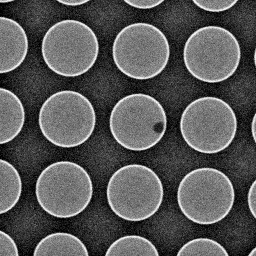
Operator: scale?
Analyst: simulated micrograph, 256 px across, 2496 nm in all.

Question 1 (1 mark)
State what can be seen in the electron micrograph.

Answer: an array of small figures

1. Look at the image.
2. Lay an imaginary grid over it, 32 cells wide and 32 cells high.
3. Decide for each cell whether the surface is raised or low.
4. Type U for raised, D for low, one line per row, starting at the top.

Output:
DDDDDDDDUUDDDDDDUUUUDDDDDUUUUDDD
DDDDDDDDDDDDDDDDDDDDDDDDDDDDDDDD
UDDDDDDDDDDDDDDDDDDDDDDDDDDDDDDD
UUUDDDUUUUUDDDDDUUUDDDDDDUUDDDDD
UUUDDDUUUUUUDDDUUUUUDDDDUUUUUDDD
UUUDDUUUUUUUDDUUUUUUUDDUUUUUUUDD
UUUDDUUUUUUUDDUUUUUUUDDUUUUUUUDD
UUUDDDUUUUUUDDUUUUUUUDDUUUUUUUDD
UUDDDDUUUUUDDDDUUUUUDDDUUUUUUUDD
DDDDDDDDDDDDDDDDUUUDDDDDUUUUUDDD
DDDDDDDDDDDDDDDDDDDDDDDDDDDDDDDD
UDDDDDDDUDDDDDDDDDDDDDDDDDDDDDDD
UUDDDDUUUUUDDDDUUUUDDDDDDUUUDDDD
UUUDDUUUUUUUDDUUUUUUDDDUUUUUUDDD
UUUDDUUUUUUUDDUUUUUUUDDUUUUUUDDD
UUUDDUUUUUUUDDUUUUUUUDDUUUUUUDDD
UUDDDUUUUUUDDDUUUUUUDDDUUUUUUDDD
UDDDDDUUUUUDDDDUUUUUDDDUUUUUUDDD
DDDDDDDDDDDDDDDDUUUDDDDDUUUUDDDD
DDDDDDDDDDDDDDDDDDDDDDDDDDDDDDDD
UDDDDDDUUDDDDDDDDDDDDDDDDDDDDDDD
UUDDDUUUUUUDDDDUUUUDDDDDUUUDDDDD
UUDDDUUUUUUDDDUUUUUUDDDUUUUUUDDD
UUUDDUUUUUUDDUUUUUUUDDUUUUUUUDDU
UUDDDUUUUUUDDUUUUUUUDDUUUUUUUDDU
UUDDDUUUUUUDDDUUUUUUDDUUUUUUUDDU
DDDDDDUUUUDDDDUUUUUDDDDUUUUUUDDU
DDDDDDDDDDDDDDDDDDDDDDDDUUUDDDDD
DDDDDDDDDDDDDDDDDDDDDDDDDDDDDDDD
UDDDDDUUUDDDDDDDDDDDDDDDDDDDDDDD
UUDDDUUUUUDDDDUUUUUDDDDUUUUDDDDD
UUDDUUUUUUUDDUUUUUUUDDUUUUUUDDDU